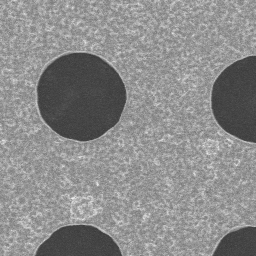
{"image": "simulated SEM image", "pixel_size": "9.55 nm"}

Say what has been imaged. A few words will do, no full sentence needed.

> holes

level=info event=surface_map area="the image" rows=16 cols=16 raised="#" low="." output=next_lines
################
################
################
####..##########
###....#######..
##......#####...
##......#####...
###....######...
####..#########.
################
################
################
################
################
###...########..
##.....#######..